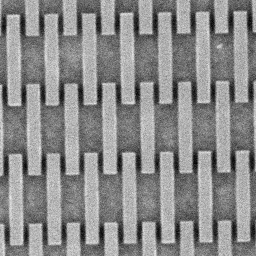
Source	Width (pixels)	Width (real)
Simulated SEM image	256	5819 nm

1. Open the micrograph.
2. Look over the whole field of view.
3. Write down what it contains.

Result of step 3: groups of lines, slits or small figures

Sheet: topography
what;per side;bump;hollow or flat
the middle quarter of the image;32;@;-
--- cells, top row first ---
-----@@@------@@@-------@@@-----
-----@@@------@@@-------@@@-----
-----@@@------@@@-------@@@-----
-----@@@------@@@-------@@@-----
-----@@@------@@@-------@@@-----
@@@--@@@--@@@-@@@--@@@--@@@--@@@
@@@--@@@--@@@-@@@@-@@@--@@@--@@@
@@@--@@@--@@@-@@@@-@@@--@@@--@@@
@@@--@@@--@@@-@@@@-@@@--@@@--@@@
@@@--@@@--@@@-@@@@-@@@--@@@--@@@
@@@-------@@@------@@@-------@@@
-@@-------@@@------@@@-------@@@
-@@-------@@@------@@@-------@@@
-@@-------@@@------@@@-------@@@
-@@-------@@@------@@@-------@@@
-@@-------@@@------@@@-------@@@
-@@-------@@@------@@@-------@@@
-@@-------@@@------@@@-------@@@
-@@-------@@@------@@@-------@@@
-@@-------@@@-------@@-------@@@
-@@-------@@@-------@@-------@@@
-@@@------@@@-------@@-------@@@
-@@@-@@@--@@@--@@@--@@--@@@--@@@
-@@@-@@@--@@@--@@@--@@--@@@--@@@
-@@@-@@@--@@@--@@@--@@--@@@--@@@
-@@@-@@@--@@@--@@@--@@--@@@--@@@
-@@@-@@@--@@@--@@@--@@--@@@--@@@
-@@--@@@-------@@@------@@@-----
-----@@@-------@@@------@@@-----
-----@@@-------@@@------@@@-----
-----@@@-------@@@------@@@-----
-----@@@-------@@@------@@@-----